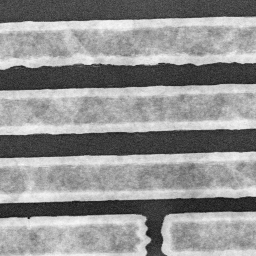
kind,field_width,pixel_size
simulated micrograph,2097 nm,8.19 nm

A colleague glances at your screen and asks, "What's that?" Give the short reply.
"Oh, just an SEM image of one or a few lines or trenches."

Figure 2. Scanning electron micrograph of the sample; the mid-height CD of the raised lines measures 0.301 um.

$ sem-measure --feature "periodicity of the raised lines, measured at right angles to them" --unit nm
548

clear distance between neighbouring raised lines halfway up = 245 nanometers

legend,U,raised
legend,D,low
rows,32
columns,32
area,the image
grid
DDDDDDDDDDDDDDDDDDDDDDDDDDDDDDDD
DDDDDDDDDDDDDDDDDDDDDDDDDDDDDDDD
DDDDDDDDDDDDDDDDDDDDDDDDDDDDDDDD
UUUUUUUUUUUUUUUUUUUUUUUUUUUUUUUU
UUUUUUUUUUUUUUUUUUUUUUUUUUUUUUUU
UUUUUUUUUUUUUUUUUUUUUUUUUUUUUUUU
UUUUUUUUUUUUUUUUUUUUUUUUUUUUUUUU
UUUUUUUUUDDDUUUUUUUDDUUUUDDDDDDD
DDDDDDDDDDDDDDDDDDDDDDDDDDDDDDDD
DDDDDDDDDDDDDDDDDDDDDDDDDDDDDDDD
DDDDDDDDDDDDDDDDDDDDDDDDDDDDDDDD
DDDDDDDDDDDDDDDUUUUUUUUUUUUUUUUU
UUUUUUUUUUUUUUUUUUUUUUUUUUUUUUUU
UUUUUUUUUUUUUUUUUUUUUUUUUUUUUUUU
UUUUUUUUUUUUUUUUUUUUUUUUUUUUUUUU
UUUUUUUUUUUUUUUUUUUUUUUUUUUUUUUU
DDDDDDDDDDDDDDDDDDDDDDDDDDDDDDDD
DDDDDDDDDDDDDDDDDDDDDDDDDDDDDDDD
DDDDDDDDDDDDDDDDDDDDDDDDDDDDDDDD
DDDDDDDDDDDDDDDDDDDDDDDDDDDDDDDD
UUUUUUUUUUUUUUUUUUUUUUUUUUUUUUUU
UUUUUUUUUUUUUUUUUUUUUUUUUUUUUUUU
UUUUUUUUUUUUUUUUUUUUUUUUUUUUUUUU
UUUUUUUUUUUUUUUUUUUUUUUUUUUUUUUU
UUUUUUUUUUUUDDDDDDDDDDDDDDDDDDDD
DDDDDDDDDDDDDDDDDDDDDDDDDDDDDDDD
DDDDDDDDDDDDDDDDDDDDDDDDDDDDDDDD
DDDDDDDDDDDDUUUUUDDDDUUUUUUUUUUU
UUUUUUUUUUUUUUUUUUDDDUUUUUUUUUUU
UUUUUUUUUUUUUUUUUUDDDUUUUUUUUUUU
UUUUUUUUUUUUUUUUUUDDDUUUUUUUUUUU
UUUUUUUUUUUUUUUUUUDDDUUUUUUUUUUU